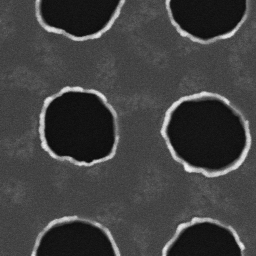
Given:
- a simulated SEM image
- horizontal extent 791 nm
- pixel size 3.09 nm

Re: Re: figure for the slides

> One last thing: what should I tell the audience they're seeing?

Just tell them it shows holes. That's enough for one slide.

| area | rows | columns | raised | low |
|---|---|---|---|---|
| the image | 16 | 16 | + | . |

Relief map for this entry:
+++....++++....+
+++....++++....+
++++++++++++++++
++++++++++++++++
++++++++++++++++
++++++++++++++++
+++....++++...++
+++....++++....+
+++....+++.....+
+++....++++....+
+++++++++++++.++
++++++++++++++++
++++++++++++++++
++++++++++++++++
+++...+++++...++
++.....++++....+